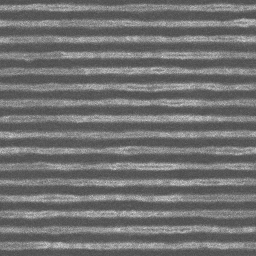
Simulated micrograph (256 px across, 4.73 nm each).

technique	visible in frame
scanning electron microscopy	parallel lines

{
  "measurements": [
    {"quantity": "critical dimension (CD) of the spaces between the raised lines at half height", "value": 0.042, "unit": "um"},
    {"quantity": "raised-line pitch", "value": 75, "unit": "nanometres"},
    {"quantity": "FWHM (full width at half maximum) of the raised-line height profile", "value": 32.5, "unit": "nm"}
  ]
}